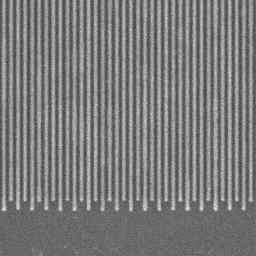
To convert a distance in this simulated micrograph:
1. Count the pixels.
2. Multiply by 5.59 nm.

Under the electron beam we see parallel lines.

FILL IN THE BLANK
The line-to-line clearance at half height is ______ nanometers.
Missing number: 25.2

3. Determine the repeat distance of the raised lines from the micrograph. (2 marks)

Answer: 39.4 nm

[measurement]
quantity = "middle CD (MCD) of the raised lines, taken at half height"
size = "15.4 nanometres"